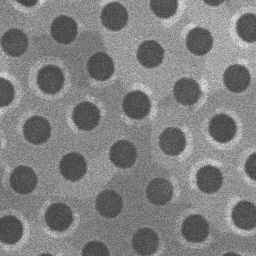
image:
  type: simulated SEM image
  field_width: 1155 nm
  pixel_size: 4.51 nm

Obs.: a regular array of holes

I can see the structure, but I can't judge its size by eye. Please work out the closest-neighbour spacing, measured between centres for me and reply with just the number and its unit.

231 nm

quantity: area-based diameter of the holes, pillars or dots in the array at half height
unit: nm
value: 134